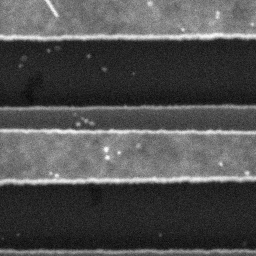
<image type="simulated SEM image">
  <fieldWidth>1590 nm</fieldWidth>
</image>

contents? lines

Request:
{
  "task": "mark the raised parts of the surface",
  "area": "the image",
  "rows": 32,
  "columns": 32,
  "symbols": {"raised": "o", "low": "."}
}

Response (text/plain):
oooooooooooooooooooooooooooooooo
oooooooooooooooooooooooooooooooo
oooooooooooooooooooooooooooooooo
oooooooooooooooooooooooooooooooo
oooooooooooooooooooooooooooooooo
................................
................................
................................
................................
................................
................................
................................
................................
...............o.oo..ooooooooooo
oooooooooooooooooooooooooooooooo
oooooooooooooooooooooooooooooooo
oooooooooooooooooooooooooooooooo
oooooooooooooooooooooooooooooooo
oooooooooooooooooooooooooooooooo
oooooooooooooooooooooooooooooooo
oooooooooooooooooooooooooooooooo
oooooooooooooooooooooooooooooooo
ooooooooooooooooooooooooo.......
................................
................................
................................
................................
................................
................................
................................
................................
o................oo.......ooooo.